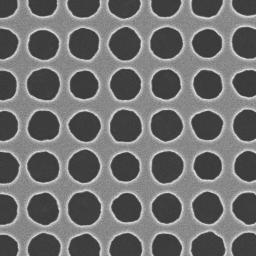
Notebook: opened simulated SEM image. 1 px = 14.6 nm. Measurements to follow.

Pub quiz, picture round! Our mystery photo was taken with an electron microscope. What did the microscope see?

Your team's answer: a regular array of holes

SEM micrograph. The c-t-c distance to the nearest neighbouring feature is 0.59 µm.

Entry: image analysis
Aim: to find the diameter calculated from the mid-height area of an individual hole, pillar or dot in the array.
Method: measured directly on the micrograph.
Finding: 452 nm